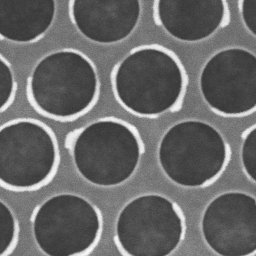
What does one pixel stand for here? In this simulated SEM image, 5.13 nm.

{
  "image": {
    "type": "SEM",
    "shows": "holes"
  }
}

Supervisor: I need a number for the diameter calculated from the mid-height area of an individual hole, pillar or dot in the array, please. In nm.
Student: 331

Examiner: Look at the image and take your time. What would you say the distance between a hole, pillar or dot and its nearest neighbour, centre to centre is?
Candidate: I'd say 422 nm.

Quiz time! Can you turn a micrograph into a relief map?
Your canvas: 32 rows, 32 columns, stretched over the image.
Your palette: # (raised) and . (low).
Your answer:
.......##........###........##..
.......##........###........##..
......###........###........##..
......####.......####......####.
.....######.....######....######
################################
#################...########...#
#####......#####......####......
.####......####.......####......
.###........###........##.......
..##........##.........##.......
.###........###.......###.......
.###.......####.......####......
#####......#####.....######.....
#######.########################
##..########...#######....######
......####......#####......####.
......####.......###........###.
.......##........###........##..
.......##........###........##..
.......###.......###........##..
......####.......####......####.
.....######.....######....######
################################
#######..#########.########....#
#####......#####.....#####......
.####.......###.......####......
..##........###.......###.......
..##........###........##.......
..##........###........###......
.####......####.......####......
######....######.....######.....